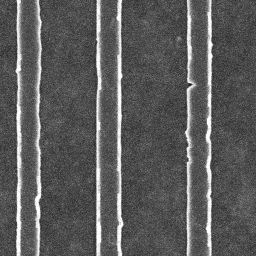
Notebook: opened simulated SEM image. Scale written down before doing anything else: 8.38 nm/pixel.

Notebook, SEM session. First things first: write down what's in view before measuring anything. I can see one or a few lines or trenches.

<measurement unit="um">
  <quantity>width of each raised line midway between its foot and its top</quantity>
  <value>0.191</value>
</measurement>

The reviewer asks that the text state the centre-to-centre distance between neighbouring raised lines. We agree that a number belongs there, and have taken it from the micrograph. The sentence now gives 85.3 px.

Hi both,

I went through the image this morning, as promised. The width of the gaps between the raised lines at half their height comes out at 521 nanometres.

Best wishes